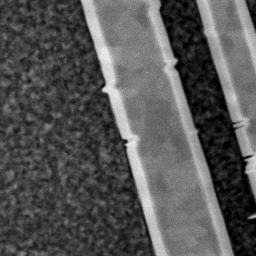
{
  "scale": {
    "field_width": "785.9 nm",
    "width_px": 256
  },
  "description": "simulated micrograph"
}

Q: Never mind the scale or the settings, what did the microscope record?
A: one or a few lines or trenches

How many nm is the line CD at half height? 191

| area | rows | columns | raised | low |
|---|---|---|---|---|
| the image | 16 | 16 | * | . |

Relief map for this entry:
......****...**.
......****...**.
......****...***
.......****...**
.......****...**
.......****...**
.......****....*
........****...*
........****...*
........****...*
.........****...
.........****...
.........****...
.........*****..
..........****..
..........****..